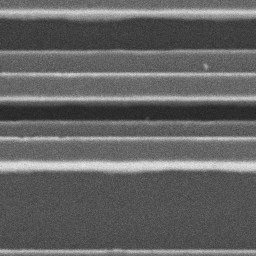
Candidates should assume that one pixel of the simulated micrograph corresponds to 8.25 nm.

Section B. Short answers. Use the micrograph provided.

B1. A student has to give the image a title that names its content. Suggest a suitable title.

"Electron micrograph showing lines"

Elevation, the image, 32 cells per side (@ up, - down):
@@@@@@@@@@@@@@@@@@@@@@@@@@@@@@@@
@@@@@@@@@@@@@@@@@@@@@@@@@@@@@@@@
--------------------------------
--------------------------------
--------------------------------
--------------------------------
--@@-@@@---@@@@@@@@@@@@@@@@@@@@@
@@@@@@@@@@@@@@@@@@@@@@@@@@@@@@@@
@@@@@@@@@@@@@@@@@@@@@@@@@@@@@@@@
@@@@@@@@@@@@@@@@@@@@@@@@@@@@@@@@
@@@@@@@@@@@@@@@@@@@@@@@@@@@@@@@@
@@@@@@@@@@@@@@@@@@@@@@@@@@@@@@@@
@@@@@@@@@@@@@@@@@@@@@@@@@@@@@@@@
--------------------------------
--------------------------------
@@@@@@@@@@@@@@@@@@@@@@@@@@@@@@@@
@@@@@@@@@@@@@@@@@@@@@@@@@@@@@@@@
@@@@@@@@@@@@@@@@@@@@@@@@@@@@@@@@
@@@@@@@@@@@@@@@@@@@@@@@@@@@@@@@@
@@@@@@@@@@@@@@@@@@@@@@@@@@@@@@@@
@@@@@@@@@@@@@@@@@@@@@@@@@@@@@@@@
--------------------------------
--------------------------------
--------------------------------
--------------------------------
--------------------------------
--------------------------------
--------------------------------
--------------------------------
--------------------------------
--------------------------------
@@@@@@@@@@@@@@@@@@@@@@@@@@@@@@@@